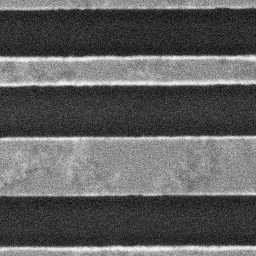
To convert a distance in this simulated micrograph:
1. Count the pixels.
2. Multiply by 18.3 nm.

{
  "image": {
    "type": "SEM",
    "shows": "lines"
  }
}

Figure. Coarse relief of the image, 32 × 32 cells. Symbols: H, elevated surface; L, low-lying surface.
HHHHHHHHHHHHHHHHHHHHHHHHHHHHHHHH
LLLLLLLLLLLLLLLLLLLLLLLLLLLLLLLL
LLLLLLLLLLLLLLLLLLLLLLLLLLLLLLLL
LLLLLLLLLLLLLLLLLLLLLLLLLLLLLLLL
LLLLLLLLLLLLLLLLLLLLLLLLLLLLLLLL
LLLLLLLLLLLLLLLLLLLLLLLLLLLLLLLL
LLLLLLLLLLLLLLLLLLLLLLLLLLLLLLLL
HHHHHHHHHHHHHHHHHHHHHHHHHHHHHHHH
HHHHHHHHHHHHHHHHHHHHHHHHHHHHHHHH
HHHHHHHHHHHHHHHHHHHHHHHHHHHHHHHH
HHHHHHHHHHHHHHHHHHHHHHHHHHHLLLHL
LLLLLLLLLLLLLLLLLLLLLLLLLLLLLLLL
LLLLLLLLLLLLLLLLLLLLLLLLLLLLLLLL
LLLLLLLLLLLLLLLLLLLLLLLLLLLLLLLL
LLLLLLLLLLLLLLLLLLLLLLLLLLLLLLLL
LLLLLLLLLLLLLLLLLLLLLLLLLLLLLLLL
LLLLLLLLLLLLLLLLLLLLLLLLLLLLLLLL
HHHHHHHHHHHHHHHHHHHHHHHHHHHHHHHH
HHHHHHHHHHHHHHHHHHHHHHHHHHHHHHHH
HHHHHHHHHHHHHHHHHHHHHHHHHHHHHHHH
HHHHHHHHHHHHHHHHHHHHHHHHHHHHHHHH
HHHHHHHHHHHHHHHHHHHHHHHHHHHHHHHH
HHHHHHHHHHHHHHHHHHHHHHHHHHHHHHHH
HHHHHHHHHHHHHHHHHHHHHHHHHHHHHHHH
LLLLLLLLLLLLLLLLLLLLLLLLLLLLLLLL
LLLLLLLLLLLLLLLLLLLLLLLLLLLLLLLL
LLLLLLLLLLLLLLLLLLLLLLLLLLLLLLLL
LLLLLLLLLLLLLLLLLLLLLLLLLLLLLLLL
LLLLLLLLLLLLLLLLLLLLLLLLLLLLLLLL
LLLLLLLLLLLLLLLLLLLLLLLLLLLLLLLL
LLLLLLLLLLLLLLLLLLLLLLLLLLLLLLLL
HHHHHHHHHHHHHHHHHHHHHHHHHHHHHHHH